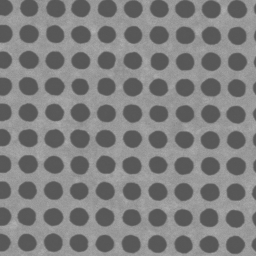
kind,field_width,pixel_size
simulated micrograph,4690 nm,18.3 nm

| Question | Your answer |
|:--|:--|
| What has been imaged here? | a regular array of holes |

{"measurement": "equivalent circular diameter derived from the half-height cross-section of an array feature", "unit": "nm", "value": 336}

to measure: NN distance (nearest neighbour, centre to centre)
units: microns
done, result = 0.471